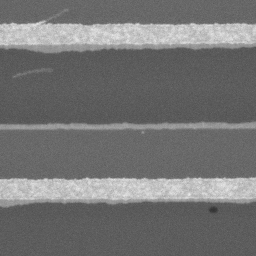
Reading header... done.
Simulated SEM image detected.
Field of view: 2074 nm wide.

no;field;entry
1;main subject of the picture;lines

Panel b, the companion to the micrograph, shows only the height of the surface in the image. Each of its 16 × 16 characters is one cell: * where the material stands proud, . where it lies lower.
****************
****************
****************
................
................
................
................
................
****************
****************
****************
****************
*********.....**
................
................
................